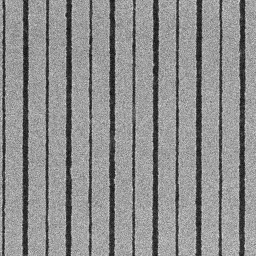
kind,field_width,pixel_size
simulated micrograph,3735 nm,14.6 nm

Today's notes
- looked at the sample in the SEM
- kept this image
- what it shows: parallel lines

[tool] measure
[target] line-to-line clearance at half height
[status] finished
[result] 65.6 nanometres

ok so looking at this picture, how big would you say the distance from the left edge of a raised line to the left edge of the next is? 316 nanometres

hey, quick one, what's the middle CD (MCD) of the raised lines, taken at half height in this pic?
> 0.246 microns